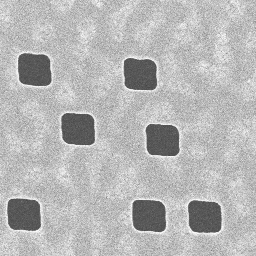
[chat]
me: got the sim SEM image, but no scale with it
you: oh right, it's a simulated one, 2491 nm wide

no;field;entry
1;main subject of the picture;holes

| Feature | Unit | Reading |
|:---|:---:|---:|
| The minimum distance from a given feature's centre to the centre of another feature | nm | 675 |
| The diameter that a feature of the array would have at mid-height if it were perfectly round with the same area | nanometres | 345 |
